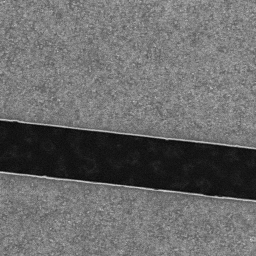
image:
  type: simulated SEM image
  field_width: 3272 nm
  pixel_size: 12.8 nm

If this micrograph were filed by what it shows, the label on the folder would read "one or a few lines or trenches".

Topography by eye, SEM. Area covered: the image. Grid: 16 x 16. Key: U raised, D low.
UUUUUUUUUUUUUUUU
UUUUUUUUUUUUUUUU
UUUUUUUUUUUUUUUU
UUUUUUUUUUUUUUUU
UUUUUUUUUUUUUUUU
UUUUUUUUUUUUUUUU
UUUUUUUUUUUUUUUU
DUUUUUUUUUUUUUUU
DDDDDDDDDUUUUUUU
DDDDDDDDDDDDDDDD
DDDDDDDDDDDDDDDD
UUUUUUUDDDDDDDDD
UUUUUUUUUUUUUUUD
UUUUUUUUUUUUUUUU
UUUUUUUUUUUUUUUU
UUUUUUUUUUUUUUUU